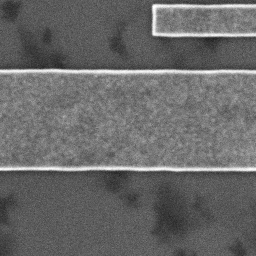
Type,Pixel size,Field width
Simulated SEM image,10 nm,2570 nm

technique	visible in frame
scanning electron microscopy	wiring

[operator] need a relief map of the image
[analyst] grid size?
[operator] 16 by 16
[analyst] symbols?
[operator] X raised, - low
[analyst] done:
----------XXXXXX
----------XXXXXX
----------------
----------------
XXXXXX----X--XX-
XXXXXXXXXXXXXXXX
XXXXXXXXXXXXXXXX
XXXXXXXXXXXXXXXX
XXXXXXXXXXXXXXXX
XXXXXXXXXXXXXXXX
XXXXXXXXXXXXXXXX
----------------
----------------
----------------
----------------
----------------